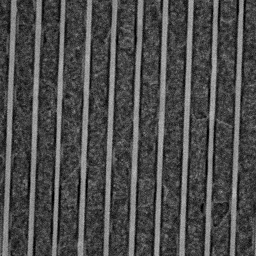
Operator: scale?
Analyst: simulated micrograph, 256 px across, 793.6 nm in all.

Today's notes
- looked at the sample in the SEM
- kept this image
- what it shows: parallel lines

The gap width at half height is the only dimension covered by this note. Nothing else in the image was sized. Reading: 63.8 nm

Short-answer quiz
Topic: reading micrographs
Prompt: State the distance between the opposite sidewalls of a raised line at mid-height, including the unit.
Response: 14.7 nanometers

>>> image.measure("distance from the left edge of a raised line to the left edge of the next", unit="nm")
78.2